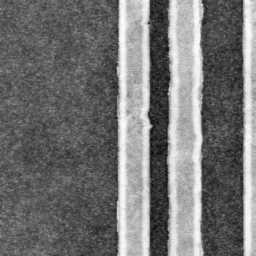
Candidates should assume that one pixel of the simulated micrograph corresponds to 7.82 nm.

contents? one or a few lines or trenches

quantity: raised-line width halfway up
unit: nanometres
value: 185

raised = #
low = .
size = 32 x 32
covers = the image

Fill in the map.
...............###....###......#
...............###....###......#
...............###....###......#
...............###....###......#
...............###....###......#
...............###....###......#
...............###....###......#
...............###....###......#
...............###....###......#
...............###....###......#
...............###....###......#
...............###....##.......#
...............###....##.......#
...............###....###......#
...............###....###......#
...............###....###......#
...............###...####......#
...............###....###......#
...............###....###......#
...............###...####......#
...............###...####......#
...............###...####......#
...............###...####......#
...............###...####......#
...............###....###......#
...............###....###......#
...............###....###......#
...............###....###......#
...............###....###......#
...............###....###......#
...............###....###......#
...............###....###......#